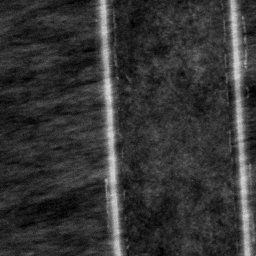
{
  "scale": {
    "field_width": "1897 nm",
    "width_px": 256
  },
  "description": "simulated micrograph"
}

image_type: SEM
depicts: one or a few lines or trenches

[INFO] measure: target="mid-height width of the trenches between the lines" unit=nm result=960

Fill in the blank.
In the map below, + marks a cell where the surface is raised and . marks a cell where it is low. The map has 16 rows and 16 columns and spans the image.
++++++.........+
+++++++........+
+++++++........+
+++++++........+
+++++++........+
+++++++........+
+++++++........+
+++++++........+
+++++++........+
+++++++........+
+++++++........+
+++++++........+
+++++++........+
+++++++........+
+++++++........+
+++++++........+